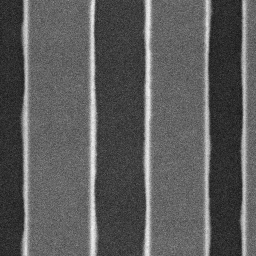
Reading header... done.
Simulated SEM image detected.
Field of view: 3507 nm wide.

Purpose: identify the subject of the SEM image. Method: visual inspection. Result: lines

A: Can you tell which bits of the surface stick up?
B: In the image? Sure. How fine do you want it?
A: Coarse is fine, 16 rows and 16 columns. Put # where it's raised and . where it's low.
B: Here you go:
..####...####..#
..####...####..#
..####...####..#
..####...####..#
..####...####..#
..####...####..#
..####...####..#
..####...####..#
..####...####..#
..####...####..#
..####...####..#
..####...####..#
..####...####..#
..####...####..#
..####...####..#
..####...####..#